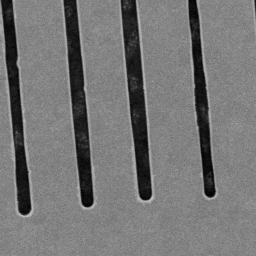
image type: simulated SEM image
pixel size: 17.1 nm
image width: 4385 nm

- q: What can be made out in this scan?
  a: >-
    one or a few lines or trenches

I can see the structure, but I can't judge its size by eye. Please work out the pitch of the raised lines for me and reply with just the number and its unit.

1060 nanometers